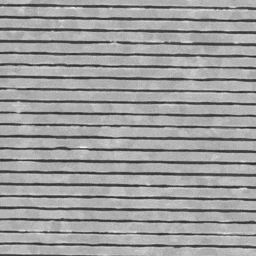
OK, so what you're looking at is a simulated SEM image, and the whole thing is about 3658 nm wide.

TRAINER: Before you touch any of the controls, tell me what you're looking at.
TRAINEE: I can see parallel lines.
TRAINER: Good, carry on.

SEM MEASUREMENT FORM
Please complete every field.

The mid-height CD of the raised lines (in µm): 0.125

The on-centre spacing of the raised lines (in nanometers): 170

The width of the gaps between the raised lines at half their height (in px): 2.62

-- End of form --